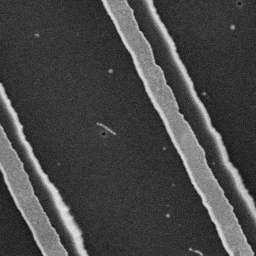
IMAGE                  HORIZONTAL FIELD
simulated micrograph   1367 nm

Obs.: lines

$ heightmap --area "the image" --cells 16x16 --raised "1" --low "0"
0000000110000000
0000000111000000
0000000011100000
0000000011100000
0000000001110000
0000000001110000
1000000000110000
1000000000111000
1000000000011100
1100000000011100
1100000000001100
1110000000001110
0111000000000110
0111000000000111
0011100000000011
0011100000000011